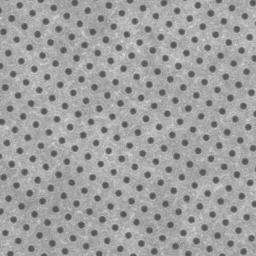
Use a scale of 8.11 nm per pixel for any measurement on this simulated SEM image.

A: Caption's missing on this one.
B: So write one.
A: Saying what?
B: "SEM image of a regular array of holes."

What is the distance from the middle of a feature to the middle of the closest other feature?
122 nanometres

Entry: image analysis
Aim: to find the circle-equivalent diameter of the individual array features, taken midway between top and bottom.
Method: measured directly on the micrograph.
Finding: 61.4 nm